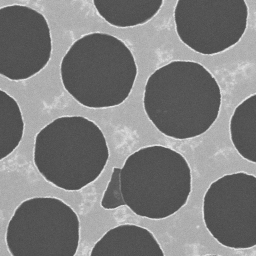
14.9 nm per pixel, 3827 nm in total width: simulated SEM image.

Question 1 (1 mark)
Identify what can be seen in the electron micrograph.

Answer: holes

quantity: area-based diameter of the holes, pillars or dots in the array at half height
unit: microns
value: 1.13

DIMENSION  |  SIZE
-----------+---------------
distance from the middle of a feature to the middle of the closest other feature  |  1280 nm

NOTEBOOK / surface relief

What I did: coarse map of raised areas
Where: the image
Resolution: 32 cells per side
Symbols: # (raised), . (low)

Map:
############........##.........#
.....#######........##.........#
......#######.....####.........#
......################.........#
......#####...########........##
......###......########......###
......##........#########..#####
......##.........###############
.....###.........###......######
#...####.........##.......######
########.........#.........#####
#########.......##..........####
..########......##..........###.
..################.........###..
...################........##...
...###......#######........##...
...##........#######......###...
...#.........################...
..##.........#####...#########..
.###..........##.......#######..
####.........###.......#########
#####........#..........########
######......##..........###.....
########..###...........##......
#############...........##......
###.....#####..........##.......
##.......########.....###.......
#.........################......
#.........####....########......
#.........###......########.....
#.........##........########....
#........##.........############